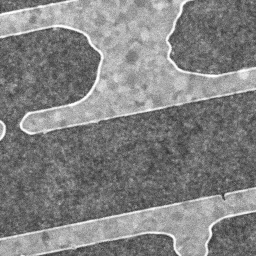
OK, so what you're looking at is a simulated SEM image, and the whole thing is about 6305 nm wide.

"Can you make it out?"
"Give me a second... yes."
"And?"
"one or a few lines or trenches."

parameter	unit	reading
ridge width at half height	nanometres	549